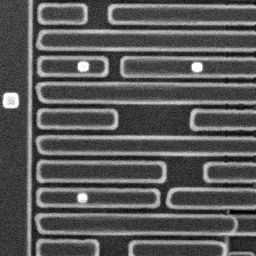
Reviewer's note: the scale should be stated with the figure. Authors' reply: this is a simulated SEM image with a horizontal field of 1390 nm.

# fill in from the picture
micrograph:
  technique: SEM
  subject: wiring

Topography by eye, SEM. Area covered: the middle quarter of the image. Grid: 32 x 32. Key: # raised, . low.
###########...##################
###########...##################
###########....#################
................................
................................
################################
################################
################################
################################
################################
................................
###.##..........................
#############...................
#############...................
#############...................
#############...................
................................
................................
################################
################################
################################
################################
....############################
................................
#####...........................
#########################.......
#########################.......
#########################.......
#########################.......
................................
................................
##############.####..##....#####